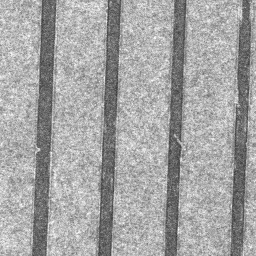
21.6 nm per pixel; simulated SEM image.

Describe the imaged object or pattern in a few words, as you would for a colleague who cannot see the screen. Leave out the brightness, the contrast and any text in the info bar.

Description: one or a few lines or trenches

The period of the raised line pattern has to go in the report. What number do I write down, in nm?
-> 1400